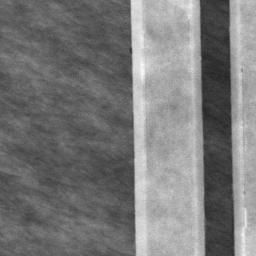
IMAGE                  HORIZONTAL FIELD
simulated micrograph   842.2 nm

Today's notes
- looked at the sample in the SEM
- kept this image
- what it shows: one or a few lines or trenches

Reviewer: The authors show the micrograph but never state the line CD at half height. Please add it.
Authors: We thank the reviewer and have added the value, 188 nm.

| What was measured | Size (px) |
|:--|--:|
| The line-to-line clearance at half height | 39.6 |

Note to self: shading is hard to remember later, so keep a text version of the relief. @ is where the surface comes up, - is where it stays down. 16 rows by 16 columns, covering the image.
---------@@@---@
---------@@@---@
---------@@@---@
---------@@@---@
---------@@@---@
---------@@@---@
---------@@@---@
---------@@@---@
---------@@@---@
---------@@@---@
---------@@@---@
---------@@@---@
---------@@@---@
---------@@@---@
---------@@@---@
---------@@@---@